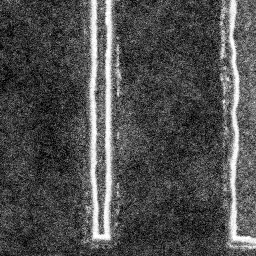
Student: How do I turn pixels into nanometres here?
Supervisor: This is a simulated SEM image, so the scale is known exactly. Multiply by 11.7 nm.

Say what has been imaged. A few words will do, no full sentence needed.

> one or a few lines or trenches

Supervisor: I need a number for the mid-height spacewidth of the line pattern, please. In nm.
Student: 1460